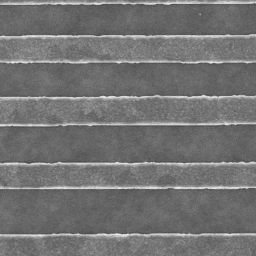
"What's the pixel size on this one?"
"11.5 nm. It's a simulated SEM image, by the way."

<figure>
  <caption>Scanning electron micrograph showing lines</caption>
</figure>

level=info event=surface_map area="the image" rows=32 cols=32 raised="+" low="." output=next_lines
++++++...++++...+.++++..........
................................
................................
................................
...+++++++++++++++++++++++++++++
++++++++++++++++++++++++++++++++
++++++++++++++++++++++++++++++++
++++++++++++++++++++++++++++++++
................................
................................
................................
................................
++++++++++++++++++++++++++++++++
++++++++++++++++++++++++++++++++
++++++++++++++++++++++++++++++++
++++++++++++++++++++++++++++....
................................
................................
................................
................................
+++.++++++++++++++++++++++++++++
++++++++++++++++++++++++++++++++
++++++++++++++++++++++++++++++++
+++++++++++++++++++++.++++++++..
................................
................................
................................
................................
................................
++++++++++++++++++++++++++++++++
++++++++++++++++++++++++++++++++
++++++++++++++++++++++++++++++++